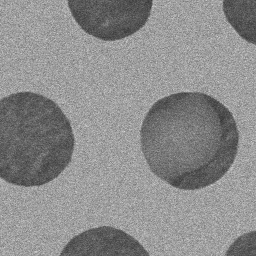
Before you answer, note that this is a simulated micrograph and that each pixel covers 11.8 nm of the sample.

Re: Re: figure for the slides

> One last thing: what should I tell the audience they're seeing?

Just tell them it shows holes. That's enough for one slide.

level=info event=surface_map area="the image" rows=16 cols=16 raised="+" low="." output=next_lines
++++.....+++++..
+++++....+++++..
+++++++++++++++.
++++++++++++++++
++++++++++++++++
++++++++++++++++
...+++++++....++
....+++++......+
.....++++......+
.....++++......+
....+++++.....++
+..++++++++..+++
++++++++++++++++
++++++++++++++++
+++++...++++++++
++++.....+++++..